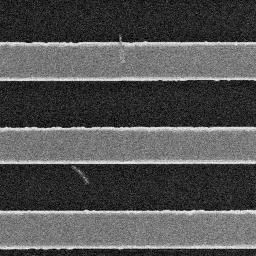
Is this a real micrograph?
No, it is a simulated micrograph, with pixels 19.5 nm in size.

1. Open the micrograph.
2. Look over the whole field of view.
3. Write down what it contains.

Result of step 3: lines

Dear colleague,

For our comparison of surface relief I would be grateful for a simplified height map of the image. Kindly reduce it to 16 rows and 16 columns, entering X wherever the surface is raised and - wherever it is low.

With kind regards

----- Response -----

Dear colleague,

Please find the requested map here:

----------------
----------------
----------------
XXXXXXXXXXXXXXXX
XXXXXXXXXXXXXXXX
----------------
----------------
----------------
XXXXXXXXXXXXXXXX
XXXXXXXXXXXXXXXX
----------------
----------------
----------------
XXXXXXXXXXXXXXXX
XXXXXXXXXXXXXXXX
----------------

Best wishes